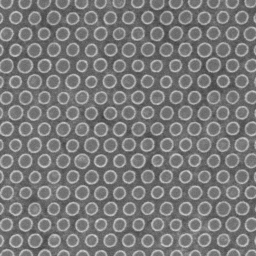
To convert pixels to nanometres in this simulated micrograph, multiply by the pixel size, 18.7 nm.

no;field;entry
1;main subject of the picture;a regular array of raised bodies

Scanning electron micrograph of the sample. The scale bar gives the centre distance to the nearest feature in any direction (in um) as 0.338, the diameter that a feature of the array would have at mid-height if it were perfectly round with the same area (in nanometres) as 239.